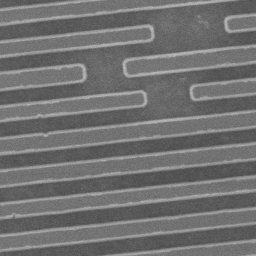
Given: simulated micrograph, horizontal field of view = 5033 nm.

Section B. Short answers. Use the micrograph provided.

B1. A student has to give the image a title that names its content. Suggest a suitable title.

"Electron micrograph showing parallel lines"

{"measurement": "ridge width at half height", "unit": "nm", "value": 308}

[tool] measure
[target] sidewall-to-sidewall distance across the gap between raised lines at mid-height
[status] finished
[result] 325 nm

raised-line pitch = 0.631 um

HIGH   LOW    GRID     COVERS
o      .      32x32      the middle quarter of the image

ooooo..........ooooooooooooooooo
ooooo..........ooooooooooooooo..
ooooo...........oooo............
ooooo...........................
oo..............................
................................
................................
..............oooooo............
...ooooooooooooooooo............
oooooooooooooooooooo............
ooooooooooooooooooo.............
oooooooooo......................
o...............................
................................
......................oooooooooo
.............ooooooooooooooooooo
....oooooooooooooooooooooooooooo
oooooooooooooooooooooooooooooooo
oooooooooooooooooooooo..........
ooooooooooooo...................
oooo............................
................................
.......................ooooooooo
............oooooooooooooooooooo
.....ooooooooooooooooooooooooooo
oooooooooooooooooooooooooooooooo
ooooooooooooooooooooooo.........
oooooooooooooo..................
ooooo...........................
................................
........................oooooooo
.................ooooooooooooooo